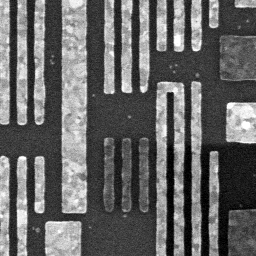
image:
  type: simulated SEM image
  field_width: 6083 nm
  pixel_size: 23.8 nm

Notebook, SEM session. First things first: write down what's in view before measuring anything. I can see wiring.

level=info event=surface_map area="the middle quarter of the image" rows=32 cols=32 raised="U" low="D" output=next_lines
UUUUUDDDDDUUDDDUUDDUUDDDDDDDDDDD
UUUUUDDDDDUUDDDUUDDUUDDDDDDDDDDD
UUUUUDDDDDUUDDDUUDDUUDDDDDDDDDDD
UUUUUDDDDDUUDDDUUDDUUDDDDDDDDDDD
UUUUUDDDDDUUDDDUUDDUUDDDDDDDDDDD
UUUUUDDDDDUUDDDUUDDUUDDUUUUUUUDD
UUUUUDDDDDUUDDDUUDDUUDDUUUUUUUDD
UUUUUDDDDDDDDDDDDDDDDDDUUUDUUUDD
UUUUUDDDDDDDDDDDDDDDDDDUUDDDUUDD
UUUUUDDDDDDDDDDDDDDDDDDUUDDDUUDD
UUUUUDDDDDDDDDDDDDDDDDDUUDDDUUDD
UUUUUDDDDDDDDDDDDDDDDDDUUDDDUUDD
UUUUUDDDDDDDDDDDDDDDDDDUUDDDUUDD
UUUUUDDDDDDDDDDDDDDDDDDUUDDDUUDD
UUUUUDDDDDDDDDDDDDDDDDDUUDDDUUDD
UUUUUDDDDDDDDDDDDDDDDDDUUDDDUUDD
UUUUUDDDDDDDDDDDDDDDDDDUUDDDUUDD
UUUUUDDDDDDDDDDDDDDDDDDUUDDDUUDD
UUUUUDDDDDDDDDDDDDDDDDDUUDDDUUDD
UUUUUDDDDDUUDDDUUDDUUDDUUDDDUUDD
UUUUUDDDDDUUDDDUUDDUUDDUUDDDUUDD
UUUUUDDDDDUUDDDUUDDUUDDUUDDDUUDD
UUUUUDDDDDUUDDDUUDDUUDDUUDDDUUDD
UUUUUDDDDDUUDDDUUDDUUDDUUDDDUUDD
UUUUUDDDDDUUDDDUUDDUUDDUUDDDUUDD
UUUUUDDDDDUUDDDUUDDUUDDUUDDDUUDD
UUUUUDDDDDUUDDDUUDDUUDDUUDDDUUDD
UUUUUDDDDDUUDDDUUDDUUDDUUDDDUUDD
UUUUUDDDDDUUDDDUUDDUUDDUUDDDUUDD
UUUUUDDDDDUUDDDUUDDUUDDUUDDDUUDD
UUUUUDDDDDUUDDDUDDDUUDDUUDDDUUDD
UUUUUDDDDDUUDDDUDDDUUDDUUDDDUUDD